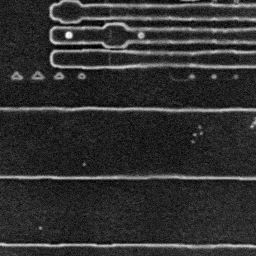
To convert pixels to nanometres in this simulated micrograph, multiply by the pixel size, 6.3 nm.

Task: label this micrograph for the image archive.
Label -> wiring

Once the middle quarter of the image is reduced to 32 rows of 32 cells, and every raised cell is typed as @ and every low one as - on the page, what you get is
@@@@@@@@@@@@@@@@@@--------------
--------------------------------
--------------------------------
--------------------------------
--------------------------------
--------------------------------
--------------------------------
--------------------------------
--------------------------------
--------------------------------
--------------------------------
@@@@@@@@@@@@@@@@@@@@@@@@@-------
@@@@@@@@@@@@@@@@@@@@@@@@@@@@@@@@
@@@@@@@@@@@@@@@@@@@@@@@@@@@@@@@@
@@@@@@@@@@@@@@@@@@@@@@@@@@@@@@@@
@@@@@@@@@@@@@@@@@@@@@@@@@@@@@@@@
@@@@@@@@@@@@@@@@@@@@@@@@@@@@@@@@
@@@@@@@@@@@@@@@@@@@@@@@@@@@@@@@@
@@@@@@@@@@@@@@@@@@@@@@@@@@@@@@@@
@@@@@@@@@@@@@@@@@@@@@@@@@@@@@@@@
@@@@@@@@@@@@@@@@@@@@@@@@@@@@@@@@
@@@@@@@@@@@@@@@@@@@@@@@@@@@@@@@@
@@@@@@@@@@@@@@@@@@@@@@@@@@@@@@@@
@@@@@@@@@@@@@@@@@@@@@@@@@@@@@@@@
@@@@@@@@@@@@@@@@@@@@@@@@@@@@@@@@
@@@@@@@@@@@@@@@@@@@@@@@@@@@@@@@@
@@@@@@@@@@@@@@@@@@@@@@@@@@@@@@@@
@@@@@@@@@@@@@@@@@@@@@@@@@@@@@@@@
@@@@@@@@@@@@@-----------------@@
--------------------------------
--------------------------------
--------------------------------